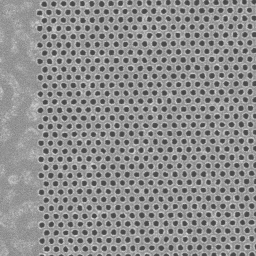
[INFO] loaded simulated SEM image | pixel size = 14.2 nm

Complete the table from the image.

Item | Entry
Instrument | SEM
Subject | a regular array of holes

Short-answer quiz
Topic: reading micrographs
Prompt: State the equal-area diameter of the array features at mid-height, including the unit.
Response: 83.3 nanometres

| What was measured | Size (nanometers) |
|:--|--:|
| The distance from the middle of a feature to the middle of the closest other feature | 129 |